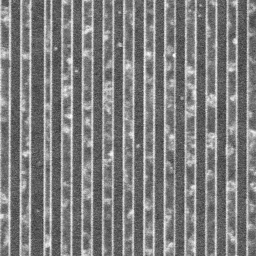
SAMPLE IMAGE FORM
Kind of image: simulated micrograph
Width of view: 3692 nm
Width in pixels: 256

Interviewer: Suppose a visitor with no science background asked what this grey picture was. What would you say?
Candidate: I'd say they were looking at parallel lines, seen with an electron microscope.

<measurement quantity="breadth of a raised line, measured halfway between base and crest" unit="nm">148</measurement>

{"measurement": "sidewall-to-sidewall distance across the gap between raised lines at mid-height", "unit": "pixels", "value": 10.2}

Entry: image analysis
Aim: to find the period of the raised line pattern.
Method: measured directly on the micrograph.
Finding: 20.6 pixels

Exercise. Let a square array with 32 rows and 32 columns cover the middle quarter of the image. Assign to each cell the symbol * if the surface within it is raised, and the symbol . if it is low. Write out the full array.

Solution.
**...**...**...**...**...***...*
**...**...**...**...**...***...*
**...**...**...**...**...***...*
**...**...**...**...**...***...*
**...**...**...**...**...***...*
**...**...**...**...**...***...*
**...**....*...**...**...***...*
**...**...**...**...**...***...*
**...**...**...**...**...***...*
**...**...**...**...**...***...*
**...**...**...**...**...***...*
**...**...**...**...**...***...*
**...**...**...**...**...***...*
**...**...**...**...**...***...*
**...**...**...**...**...***...*
**...**...**...**...**...***...*
.*...**...**...**...**...***...*
**...**...**...**...**...***...*
**...**...**...**...**...***...*
**...**...**...**...**...***...*
**...**...**...**...**...***...*
**...**...**...**...**...***...*
**...**...**...**...**...***...*
**...**...**...**...**...***...*
**...**...**...**...**...***..*.
**...**...**...**...**...***..**
**...**...**...**...**...***..**
**...**...**...**...**...***..**
**...**...**...**...**...***..**
**...**...**...**...**...***..**
**...**...**...**...**...***..**
**...**...**...**...**...***..**